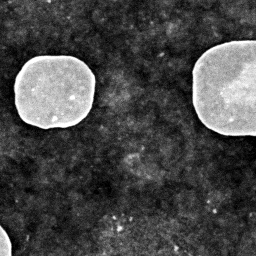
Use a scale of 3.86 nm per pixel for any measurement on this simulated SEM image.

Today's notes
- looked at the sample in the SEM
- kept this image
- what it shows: raised bodies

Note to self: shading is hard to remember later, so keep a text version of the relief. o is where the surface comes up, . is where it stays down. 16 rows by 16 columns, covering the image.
................
................
................
.............ooo
.ooooo......oooo
.ooooo......oooo
.ooooo......oooo
..ooo........ooo
................
................
................
................
................
................
................
o...............